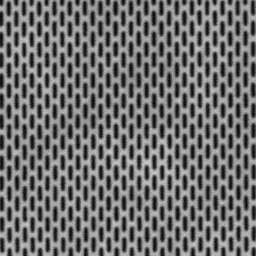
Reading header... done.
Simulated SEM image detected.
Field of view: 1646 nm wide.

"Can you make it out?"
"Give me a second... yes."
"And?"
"a regular array of holes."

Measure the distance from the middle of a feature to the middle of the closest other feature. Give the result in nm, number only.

80.5